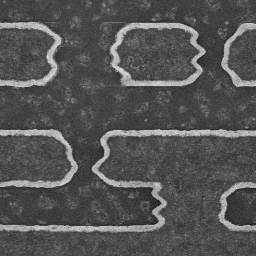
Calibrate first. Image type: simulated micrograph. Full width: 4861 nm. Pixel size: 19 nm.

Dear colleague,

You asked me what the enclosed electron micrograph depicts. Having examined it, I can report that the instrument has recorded one or a few lines or trenches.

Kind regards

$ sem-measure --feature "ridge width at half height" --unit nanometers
997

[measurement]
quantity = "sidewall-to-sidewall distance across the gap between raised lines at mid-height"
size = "916 nm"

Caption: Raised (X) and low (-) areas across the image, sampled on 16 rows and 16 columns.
----------------
----------------
XXXX---XXXXX--XX
XXX----XXXXX--XX
XXX-----XXXX--XX
----------------
----------------
----------------
XXXX---XXXXXXXXX
XXXX---XXXXXXXXX
XXXXX-XXXXXXXXXX
XXXX---XXXXXXXXX
----------XXXX--
----------XXXX--
XXXXXXXXXXXXXXXX
XXXXXXXXXXXXXXXX